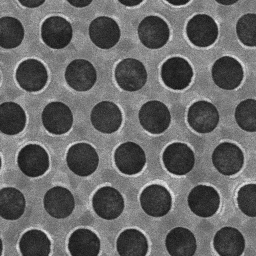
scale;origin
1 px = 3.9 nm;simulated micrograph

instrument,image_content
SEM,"a regular array of holes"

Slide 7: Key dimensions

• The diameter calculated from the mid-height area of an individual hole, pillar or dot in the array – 0.128 microns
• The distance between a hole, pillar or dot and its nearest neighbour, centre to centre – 0.187 microns